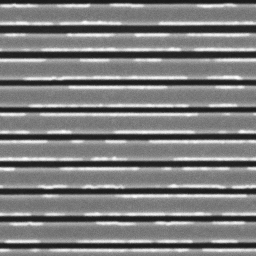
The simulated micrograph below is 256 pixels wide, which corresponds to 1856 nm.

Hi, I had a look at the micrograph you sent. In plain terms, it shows parallel lines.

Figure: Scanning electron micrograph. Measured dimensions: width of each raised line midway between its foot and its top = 150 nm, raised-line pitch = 197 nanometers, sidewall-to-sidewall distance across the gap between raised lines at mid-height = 46.2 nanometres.